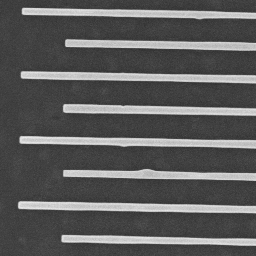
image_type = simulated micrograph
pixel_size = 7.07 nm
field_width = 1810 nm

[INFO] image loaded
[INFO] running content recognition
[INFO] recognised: parallel lines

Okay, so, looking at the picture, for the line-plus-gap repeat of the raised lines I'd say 229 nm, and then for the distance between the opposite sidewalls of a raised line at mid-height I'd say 0.0477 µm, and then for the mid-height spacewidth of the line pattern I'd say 178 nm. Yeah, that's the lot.